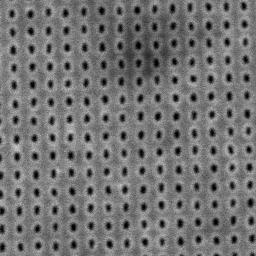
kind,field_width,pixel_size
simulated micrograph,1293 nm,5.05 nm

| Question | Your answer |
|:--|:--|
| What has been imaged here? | a regular array of holes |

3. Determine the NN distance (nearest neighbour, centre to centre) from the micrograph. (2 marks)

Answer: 0.0876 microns